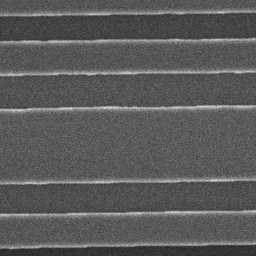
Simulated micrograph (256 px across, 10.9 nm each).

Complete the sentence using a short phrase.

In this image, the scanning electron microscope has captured lines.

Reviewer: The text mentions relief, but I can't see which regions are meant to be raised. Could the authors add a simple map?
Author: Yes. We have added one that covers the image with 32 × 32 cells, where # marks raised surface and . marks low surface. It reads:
################################
#############################...
................................
................................
................................
################################
################################
################################
################################
................................
................................
................................
................................
.......#########################
################################
################################
################################
################################
################################
################################
################################
################################
################################
................................
................................
................................
....................############
################################
################################
################################
################################
................................